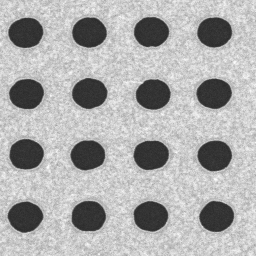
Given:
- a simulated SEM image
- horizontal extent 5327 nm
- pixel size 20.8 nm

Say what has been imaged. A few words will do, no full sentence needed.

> a regular array of holes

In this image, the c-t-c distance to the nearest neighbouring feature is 1270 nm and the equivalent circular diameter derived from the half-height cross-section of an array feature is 680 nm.